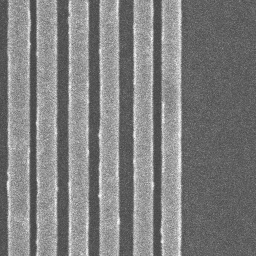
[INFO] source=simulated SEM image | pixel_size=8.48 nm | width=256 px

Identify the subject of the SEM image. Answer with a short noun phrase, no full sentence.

parallel lines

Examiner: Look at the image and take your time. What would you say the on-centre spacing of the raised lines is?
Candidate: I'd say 258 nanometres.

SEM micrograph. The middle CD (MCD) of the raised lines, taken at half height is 166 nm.